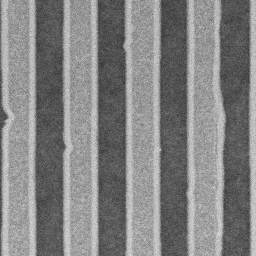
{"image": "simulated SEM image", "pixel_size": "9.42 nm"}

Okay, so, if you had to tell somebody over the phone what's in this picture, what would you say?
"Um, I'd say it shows one or a few lines or trenches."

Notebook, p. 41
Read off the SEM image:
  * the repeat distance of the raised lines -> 584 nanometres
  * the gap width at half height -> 333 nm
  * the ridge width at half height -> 0.252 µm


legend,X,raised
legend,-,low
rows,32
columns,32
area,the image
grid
-XXX-----XXX----XXXX----XXX-----
-XXX----XXXX----XXXX----XXX-----
-XXX----XXXX----XXXX----XXX-----
-XXX----XXXX----XXXX----XXX-----
-XXX----XXXX----XXXX----XXX-----
-XXX----XXXX----XXXX----XXX-----
-XXX----XXXX----XXXX----XXX-----
-XXX----XXXX----XXXX----XXX-----
-XXX----XXXX----XXX-----XXX-----
-XXX----XXXX----XXX-----XXX-----
-XXX----XXXX----XXX-----XXX-----
-XXX----XXXX----XXXX----XXX-----
-XXX----XXXX----XXXX----XXX-----
-XXX----XXXX----XXX-----XXXX----
-XXX----XXXX----XXX-----XXXX----
-XXX----XXXX----XXX-----XXXX----
-XXX-----XXX----XXXX----XXXX----
-XXX----XXXX----XXXX----XXXX----
-XXX-----XXX----XXXX----XXX-----
-XXX----XXXX----XXX-----XXX-----
-XXX----XXXX----XXX-----XXX-----
-XXX----XXXX----XXX-----XXX-----
-XXX----XXXX----XXX-----XXXX----
-XXX----XXXX----XXX-----XXXX----
-XXX----XXXX----XXX-----XXX-----
-XXX----XXXX----XXX-----XXX-----
-XXX----XXXX----XXX-----XXX-----
-XXX----XXXX----XXX-----XXX-----
-XXX----XXXX----XXX-----XXXX----
-XXX----XXXX----XXXX----XXX-----
-XXX----XXXX----XXXX----XXX-----
-XXX----XXXX----XXXX----XXX-----